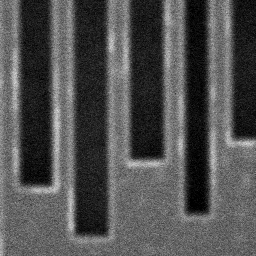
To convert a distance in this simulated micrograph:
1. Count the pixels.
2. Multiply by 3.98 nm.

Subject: parallel lines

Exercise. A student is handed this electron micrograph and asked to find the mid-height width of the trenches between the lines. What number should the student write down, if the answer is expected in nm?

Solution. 134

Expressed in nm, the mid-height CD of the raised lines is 85.5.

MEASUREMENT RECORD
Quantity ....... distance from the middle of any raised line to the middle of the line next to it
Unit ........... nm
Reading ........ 210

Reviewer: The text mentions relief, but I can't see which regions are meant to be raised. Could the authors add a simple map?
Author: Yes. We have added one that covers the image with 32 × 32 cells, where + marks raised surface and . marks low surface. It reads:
++.....++.....++.....++...+++...
++.....++.....++.....++...+++...
++.....++.....++.....++...+++...
++.....++.....++.....++...+++...
++.....++.....++.....++...+++...
++.....++.....++.....++...+++...
++.....++.....++.....++...+++...
++.....++.....++.....++...+++...
++.....++.....++.....++...+++...
++.....++.....++.....++...+++...
++.....++.....++.....++...+++...
++.....++.....++.....++...+++...
++.....++.....++.....++...+++...
++.....++.....++.....++...+++...
++.....++.....++.....++...+++...
++.....++.....++.....++...+++...
++.....++.....++.....++...+++...
++.....++.....++.....++...+++...
++.....++.....++.....++...++++++
++.....++.....++.....++...++++++
++.....++.....+++++++++...++++++
++.....++.....+++++++++...++++++
++.....++.....+++++++++...++++++
+++++++++.....+++++++++...++++++
+++++++++.....+++++++++...++++++
+++++++++.....+++++++++...++++++
+++++++++.....+++++++++...++++++
+++++++++.....++++++++++++++++++
+++++++++.....++++++++++++++++++
++++++++++...+++++++++++++++++++
++++++++++++++++++++++++++++++++
++++++++++++++++++++++++++++++++